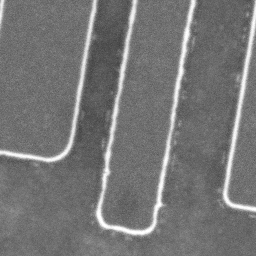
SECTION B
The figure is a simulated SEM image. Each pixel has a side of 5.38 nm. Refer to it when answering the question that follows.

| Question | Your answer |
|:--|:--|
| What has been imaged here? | one or a few lines or trenches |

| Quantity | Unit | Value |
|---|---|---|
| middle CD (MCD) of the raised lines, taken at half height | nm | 311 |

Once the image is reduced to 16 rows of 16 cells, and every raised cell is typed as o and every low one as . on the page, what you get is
oooooo..oooo....
oooooo..oooo....
oooooo..oooo....
ooooo...ooo.....
ooooo...ooo....o
ooooo..oooo....o
ooooo..oooo....o
ooooo..oooo....o
ooooo..oooo....o
oooo...ooo....oo
.......ooo....oo
......oooo....oo
......oooo....oo
......oooo......
........o.......
................